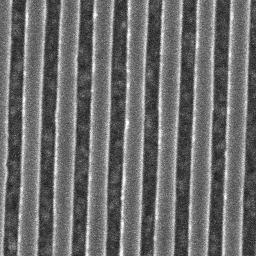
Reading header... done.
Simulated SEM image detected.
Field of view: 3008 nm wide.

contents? parallel lines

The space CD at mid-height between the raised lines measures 15.4 px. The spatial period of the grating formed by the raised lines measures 34 pixels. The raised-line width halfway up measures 222 nm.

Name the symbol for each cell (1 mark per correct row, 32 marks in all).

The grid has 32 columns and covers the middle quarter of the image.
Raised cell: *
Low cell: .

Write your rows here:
***....*****....****....*****...
***....*****....****....*****...
***....****.....****.*..*****...
***.**.****.....****....*****...
***.*..****.....****....*****...
***....*****....****....*****...
***....*****....****....*****...
***....*****....****....*****...
***....*****....****....*****...
***....****.....****....*****...
***....****.....****....*****...
***....****.....****....*****...
***....****.....****....****....
***....****.....****....****....
***....****.....****.*..****....
***....****.....****.*..****....
***....****....*****....****....
***....****....*****....****....
***....****....*****....****....
***....****....*****....****....
***....****....*****....****....
**.....****....*****....****....
***....****....*****....****....
**....*****....*****....****....
**....*****....*****....****....
**....*****....****.....****....
**..*.*****....****.....****....
**....*****....****....*****....
**....*****.*..****....*****....
**....*****....****....*****....
**....*****....****....*****....
**....*****....****....*****....